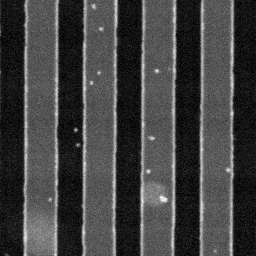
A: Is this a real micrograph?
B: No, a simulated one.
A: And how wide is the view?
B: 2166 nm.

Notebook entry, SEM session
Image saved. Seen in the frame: lines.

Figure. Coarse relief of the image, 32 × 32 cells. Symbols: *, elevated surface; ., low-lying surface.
...****....****...****...****...
...****....****...****...****...
...****....****...****...****...
...****....****...****...****...
...****....***....****...****...
...****...*****...****...****...
...****...****....****...****...
...****...****....****...****...
...****...****....****...****...
...****...****....****...****...
...****...****....****...****...
...****...****....****...****...
...****...****....****...****...
...****...****....****...****...
...****...****....****...****...
...****...****....****...****...
...****...****....****...****...
...****...****....****...****...
...****...****....****...****...
...****...****....****...****...
...****...****....****...****...
...****...****....****...****...
...****...****....****...****...
...****...****....****...****...
...****...****....****...****...
...****...****....****...****...
...****...****....****...****...
...****...****....****...****...
...****...****....****...****...
...****...****....****...****...
...****...****....****...****...
...****...****....****...****...